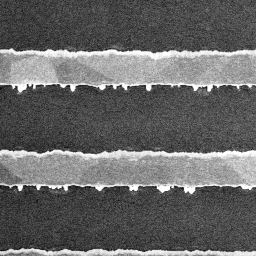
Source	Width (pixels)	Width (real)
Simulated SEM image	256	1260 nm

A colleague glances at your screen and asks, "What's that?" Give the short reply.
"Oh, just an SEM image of lines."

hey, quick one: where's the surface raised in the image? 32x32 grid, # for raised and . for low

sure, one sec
................................
................................
................................
................................
................................
................................
##...........##...............#.
################################
################################
################################
################################
................................
................................
................................
................................
................................
................................
................................
................................
################################
################################
################################
################################
....................#..##.......
................................
................................
................................
................................
................................
................................
................................
######.##..##.###..##...#.#.....